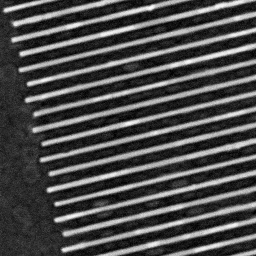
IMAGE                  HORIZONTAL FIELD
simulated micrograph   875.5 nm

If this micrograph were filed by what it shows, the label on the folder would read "parallel lines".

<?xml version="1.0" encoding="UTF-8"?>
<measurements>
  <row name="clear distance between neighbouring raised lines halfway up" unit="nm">39.1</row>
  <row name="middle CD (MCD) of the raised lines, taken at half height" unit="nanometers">12.1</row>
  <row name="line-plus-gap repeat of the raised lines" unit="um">0.0527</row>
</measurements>